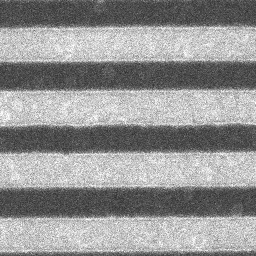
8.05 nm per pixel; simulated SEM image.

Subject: one or a few lines or trenches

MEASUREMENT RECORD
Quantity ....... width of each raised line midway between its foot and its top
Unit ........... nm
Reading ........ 260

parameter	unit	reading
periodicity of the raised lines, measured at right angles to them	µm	0.504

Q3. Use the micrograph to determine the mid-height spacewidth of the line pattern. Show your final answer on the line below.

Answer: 31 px